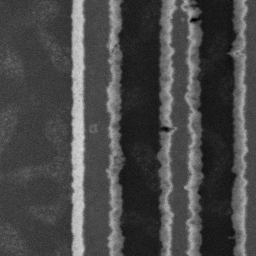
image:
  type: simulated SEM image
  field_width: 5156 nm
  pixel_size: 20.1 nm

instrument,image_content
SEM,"one or a few lines or trenches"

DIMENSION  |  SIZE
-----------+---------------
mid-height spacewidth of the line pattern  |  944 nanometers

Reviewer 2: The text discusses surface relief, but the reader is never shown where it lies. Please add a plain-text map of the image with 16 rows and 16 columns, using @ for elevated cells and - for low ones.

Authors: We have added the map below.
-----@@---@@---@
-----@@---@@---@
-----@@---@@---@
-----@@---@@---@
-----@@---@@---@
-----@@---@@---@
-----@@---@@---@
-----@@---@@---@
-----@@---@@---@
-----@@---@@---@
-----@@---@@---@
-----@@---@@---@
-----@@---@@---@
-----@@---@@---@
-----@@---@@---@
-----@@---@@---@